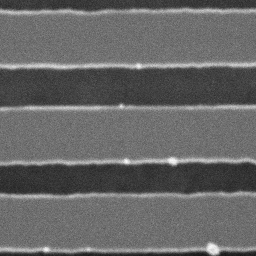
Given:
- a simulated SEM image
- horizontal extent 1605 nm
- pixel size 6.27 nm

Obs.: lines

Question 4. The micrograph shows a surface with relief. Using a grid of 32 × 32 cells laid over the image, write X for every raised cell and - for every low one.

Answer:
--------------------------------
XXXXXXXXXXX-XXXXXXXXXXXXXXXXXXXX
XXXXXXXXXXXXXXXXXXXXXXXXXXXXXXXX
XXXXXXXXXXXXXXXXXXXXXXXXXXXXXXXX
XXXXXXXXXXXXXXXXXXXXXXXXXXXXXXXX
XXXXXXXXXXXXXXXXXXXXXXXXXXXXXXXX
XXXXXXXXXXXXXXXXXXXXXXXXXXXXXXXX
XXXXXXXXXXXXXXXXXXXXXXXXXXXXXXXX
-X-----XX-----------------------
--------------------------------
--------------------------------
--------------------------------
--------------------------------
---XXXXXXXXXXXXXXXXXXXXXXXXXXXXX
XXXXXXXXXXXXXXXXXXXXXXXXXXXXXXXX
XXXXXXXXXXXXXXXXXXXXXXXXXXXXXXXX
XXXXXXXXXXXXXXXXXXXXXXXXXXXXXXXX
XXXXXXXXXXXXXXXXXXXXXXXXXXXXXXXX
XXXXXXXXXXXXXXXXXXXXXXXXXXXXXXXX
XXXXXXXXXXXXXXXXXXXXXXXXXXXXXXXX
XX-XX---------------------------
--------------------------------
--------------------------------
--------------------------------
XXXXXXXXXXXXXXXXXXXXXXXXXXXXXXXX
XXXXXXXXXXXXXXXXXXXXXXXXXXXXXXXX
XXXXXXXXXXXXXXXXXXXXXXXXXXXXXXXX
XXXXXXXXXXXXXXXXXXXXXXXXXXXXXXXX
XXXXXXXXXXXXXXXXXXXXXXXXXXXXXXXX
XXXXXXXXXXXXXXXXXXXXXXXXXXXXXXXX
XXXXXXXXXXXXXXXXXXXXXXXXXXXXXXXX
--------------------------X-----